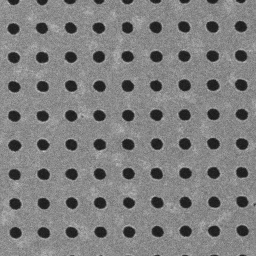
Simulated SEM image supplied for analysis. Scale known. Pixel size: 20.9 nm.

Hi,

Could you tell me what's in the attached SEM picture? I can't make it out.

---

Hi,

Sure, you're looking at a regular array of holes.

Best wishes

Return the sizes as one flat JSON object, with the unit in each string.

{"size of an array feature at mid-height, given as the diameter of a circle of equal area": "0.261 µm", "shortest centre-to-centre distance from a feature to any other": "591 nm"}